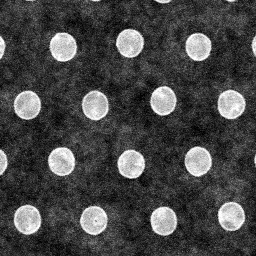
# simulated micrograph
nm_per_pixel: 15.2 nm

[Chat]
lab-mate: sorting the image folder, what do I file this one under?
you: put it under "a regular array of raised bodies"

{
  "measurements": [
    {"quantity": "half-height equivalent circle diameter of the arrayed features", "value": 402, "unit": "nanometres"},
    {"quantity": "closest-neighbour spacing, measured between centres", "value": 0.998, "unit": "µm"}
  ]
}